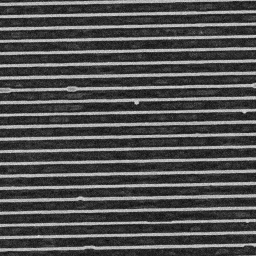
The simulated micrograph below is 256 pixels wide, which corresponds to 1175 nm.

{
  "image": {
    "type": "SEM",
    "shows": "parallel lines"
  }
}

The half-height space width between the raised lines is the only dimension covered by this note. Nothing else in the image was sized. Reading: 43.6 nm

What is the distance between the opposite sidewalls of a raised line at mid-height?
12 nm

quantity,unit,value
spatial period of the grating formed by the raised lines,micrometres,0.0563